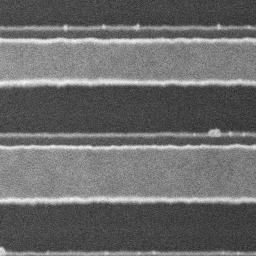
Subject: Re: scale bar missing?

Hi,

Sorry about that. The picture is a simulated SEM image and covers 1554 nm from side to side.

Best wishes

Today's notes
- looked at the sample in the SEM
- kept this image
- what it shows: lines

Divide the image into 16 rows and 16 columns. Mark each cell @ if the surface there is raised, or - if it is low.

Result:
----------------
----------------
@@@@@@@@@@@@@@@@
@@@@@@@@@@@@@@@@
@@@@@@@@@@@@@@@@
----------------
----------------
----------------
----------------
@@@@@@@@@@@@@@@@
@@@@@@@@@@@@@@@@
@@@@@@@@@@@@@@@@
@@@@@@@@@@@@@@@@
----------------
----------------
----------------